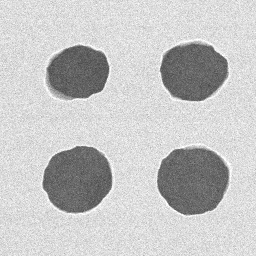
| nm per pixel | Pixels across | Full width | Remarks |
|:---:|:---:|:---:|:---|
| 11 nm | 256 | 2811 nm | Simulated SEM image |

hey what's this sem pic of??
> holes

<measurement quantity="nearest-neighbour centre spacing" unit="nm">1180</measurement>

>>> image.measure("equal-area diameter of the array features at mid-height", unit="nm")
723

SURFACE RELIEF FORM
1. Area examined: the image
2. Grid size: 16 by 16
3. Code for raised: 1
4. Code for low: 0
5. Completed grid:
1111111111111111
1111111111111111
1111111111111111
1110000111000011
1110000111000011
1110001111000011
1111111111111111
1111111111111111
1111111111111111
1111001111100111
1110000111000011
1110000111000011
1110001111000011
1111111111111111
1111111111111111
1111111111111111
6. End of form